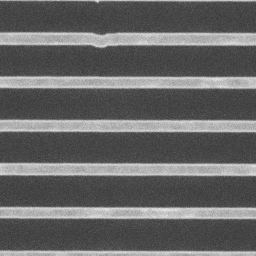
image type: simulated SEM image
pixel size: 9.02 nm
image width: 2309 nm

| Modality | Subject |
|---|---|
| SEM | parallel lines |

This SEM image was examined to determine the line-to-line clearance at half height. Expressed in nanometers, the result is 295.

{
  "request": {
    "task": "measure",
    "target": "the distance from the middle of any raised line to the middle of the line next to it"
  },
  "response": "391 nm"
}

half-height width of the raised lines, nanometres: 97